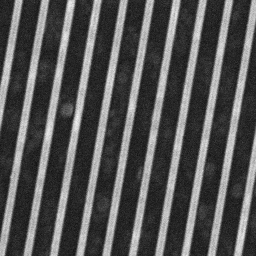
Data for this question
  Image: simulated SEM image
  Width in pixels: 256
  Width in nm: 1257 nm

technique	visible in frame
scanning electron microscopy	parallel lines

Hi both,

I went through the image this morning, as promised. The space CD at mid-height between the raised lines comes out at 96.7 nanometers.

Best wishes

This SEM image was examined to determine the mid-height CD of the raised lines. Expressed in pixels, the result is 6.05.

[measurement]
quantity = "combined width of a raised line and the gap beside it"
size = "127 nm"